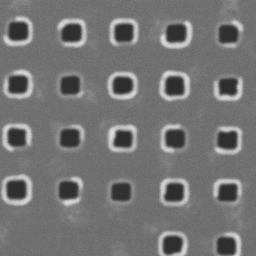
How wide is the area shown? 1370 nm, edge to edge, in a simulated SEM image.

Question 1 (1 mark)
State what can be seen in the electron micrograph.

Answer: a regular array of holes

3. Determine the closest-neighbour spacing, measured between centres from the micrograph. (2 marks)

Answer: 0.279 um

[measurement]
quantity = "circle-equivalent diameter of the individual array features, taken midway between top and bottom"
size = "0.109 um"